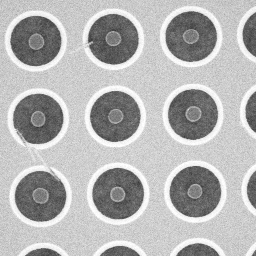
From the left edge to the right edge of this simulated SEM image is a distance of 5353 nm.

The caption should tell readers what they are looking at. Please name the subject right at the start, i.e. an array of small figures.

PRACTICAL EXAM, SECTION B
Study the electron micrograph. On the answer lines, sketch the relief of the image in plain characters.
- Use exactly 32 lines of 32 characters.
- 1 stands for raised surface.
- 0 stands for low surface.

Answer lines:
11111111111111111111111111111111
11111111111111011111110000111110
11000001111100000111100000011110
10000000111000000111100000011100
10001000111001100011000110001100
10001000111000100011000000011100
10000000111000000111100000011110
11000001111100001111110000111111
11110111111111111111111111111111
11111111111111111111111111111111
11111111111111111111111111111111
11110011111110001111110000111110
11000001111100000111100000011110
11000000111000000011100010011100
10001100111000100011100110001100
10001000111000000011100000011110
11000000111100000111100000011110
11100001111100001111111000111111
11111111111111111111111111111111
11111111111111111111111111111111
11111111111111111111111101111111
11100011111100000111110000011110
11000000111100000011100000001110
11000000111000100011100010001110
11001100011000110011100010001110
11000000111000000011100000001110
11000000111100000111110000011111
11100001111110001111111101111111
11111111111111111111111111111111
11111111111111111111111111111111
11111111111111001111111000111111
11100000111100000011110000011110